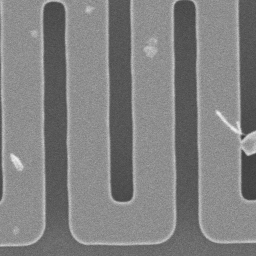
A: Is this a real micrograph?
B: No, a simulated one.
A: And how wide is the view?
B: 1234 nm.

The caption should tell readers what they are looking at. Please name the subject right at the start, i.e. groups of lines, slits or small figures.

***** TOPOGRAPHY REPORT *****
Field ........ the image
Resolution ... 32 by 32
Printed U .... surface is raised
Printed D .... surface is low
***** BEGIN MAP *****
UUUUUUDDUUUUUDDDUUUUUUDDUUUUUUDD
UUUUUDDDUUUUUDDDUUUUUUDDDUUUUUDD
UUUUUDDDUUUUUDDDUUUUUUDDDUUUUUDD
UUUUUDDDUUUUUDDDUUUUUUDDDUUUUUDD
UUUUUDDDUUUUUDDDUUUUUUDDDUUUUUDD
UUUUUDDDUUUUUDDDUUUUUUDDDUUUUUDD
UUUUUDDDUUUUUDDDUUUUUUDDDUUUUUDD
UUUUUDDDUUUUUDDDUUUUUUDDDUUUUUDD
UUUUUDDDUUUUUUDDUUUUUUDDDUUUUUDD
UUUUUDDDUUUUUUDDUUUUUUDDDUUUUUDD
UUUUUDDDUUUUUUDDDUUUUUDDDUUUUUDD
UUUUUDDDUUUUUUDDDUUUUUDDDUUUUUDD
UUUUUDDDUUUUUUDDDUUUUUDDDUUUUUDD
UUUUUDDDUUUUUUDDDUUUUUDDDUUUUUDD
UUUUUDDDDUUUUUDDDUUUUUDDDUUUUUDD
UUUUUDDDDUUUUUDDDUUUUUDDDUUUUUDD
UUUUUDDDUUUUUUDDDUUUUUDDDUUUUUDD
UUUUUDDDUUUUUUDDDUUUUUDDDUUUUUUU
UUUUUDDDUUUUUUDDDUUUUUDDDUUUUUUU
UUUUUDDDDUUUUUDDDUUUUUDDDUUUUUDD
UUUUUDDDDUUUUUDDDUUUUUDDDUUUUUDD
UUUUUUDDDUUUUUDDDUUUUUDDDUUUUUDD
UUUUUUDDDUUUUUDDDUUUUUDDDUUUUUDD
UUUUUUDDDUUUUUDDDUUUUUDDDUUUUUDD
UUUUUUDDDUUUUUDDDUUUUUDDDUUUUUDD
UUUUUUDDDUUUUUUUUUUUUUDDDUUUUUUU
UUUUUUDDDUUUUUUUUUUUUUDDDUUUUUUU
UUUUUUDDDUUUUUUUUUUUUUDDDUUUUUUU
UUUUUUDDDUUUUUUUUUUUUUDDDUUUUUUU
UUUUUDDDDUUUUUUUUUUUUDDDDDUUUUUU
UUUUDDDDDDUUUUUUUUUUDDDDDDDDDDDD
DDDDDDDDDDDDDDDDDDDDDDDDDDDDDDDD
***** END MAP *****